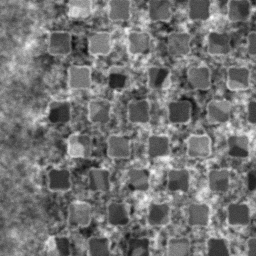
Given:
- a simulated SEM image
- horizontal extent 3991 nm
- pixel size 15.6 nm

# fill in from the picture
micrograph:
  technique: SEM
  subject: a regular array of raised bodies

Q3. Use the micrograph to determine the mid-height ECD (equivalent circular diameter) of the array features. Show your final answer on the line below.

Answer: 389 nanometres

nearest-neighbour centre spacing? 611 nm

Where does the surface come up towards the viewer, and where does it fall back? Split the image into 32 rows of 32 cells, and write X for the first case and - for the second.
---------XX---XX---XX---XX---XX-
---------XX---XX---XX--XXX---XX-
---------XX---XX---XX---XX---XX-
--------------------------------
------XXX--XXX--XXX--XXX--XXX--X
------XXX--XXX--XXX--XXX--XXX--X
------XXX--XXX--XXX--XXX--XXX--X
--------------------------------
---------XX---XX---XX---XX---XX-
---------XX---XX--XXX---XX---XX-
---------XX---XX--XXX--XXX---XX-
--------------------------------
--------------------------------
------XXX--XXX--XXX--XXX--XXX--X
------XXX--XXX--XXX--XXX--XXX--X
--------------------------------
--------------------------------
---------XX---XX---XX---XX--XXX-
---------XX--XXX--XXX--XXX--XXX-
---------XX---XX---XX---XX---XX-
--------------------------------
------XXX--XXX--XXX--XXX--XXX--X
------XXX--XXX--XXX--XXX--XXX--X
------XXX--XXX--XXX--XXX--XXX--X
--------------------------------
---------XX---XX---XX---XX---XX-
---------XX--XXX--XXX--XXX--XXX-
--------XXX--XXX--XXX--XXX--XXX-
--------------------------------
--------------------------------
------XXX--XXX--XXX--XXX--XXX--X
------XXX--XXX--XXX--XXX--XXX--X